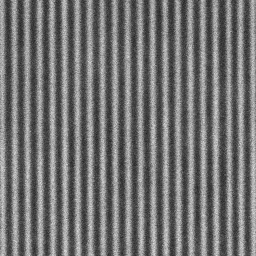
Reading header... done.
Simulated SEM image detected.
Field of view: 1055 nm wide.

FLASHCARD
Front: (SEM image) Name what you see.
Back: parallel lines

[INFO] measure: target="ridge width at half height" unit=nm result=17.5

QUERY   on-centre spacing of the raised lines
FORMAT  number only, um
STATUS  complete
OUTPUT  0.0517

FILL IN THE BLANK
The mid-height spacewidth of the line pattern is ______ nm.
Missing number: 34.5